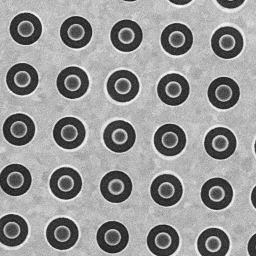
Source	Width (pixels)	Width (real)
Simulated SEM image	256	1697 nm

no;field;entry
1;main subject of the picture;an array of small figures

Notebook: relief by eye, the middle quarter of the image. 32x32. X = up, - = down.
X--XXXXXXXXXXXXXXXXXXXXXXXXXXXXX
-----XXXXXXXXX--XXXXXXXXXXXXXXXX
------XXXXXX------XXXXXXX----XXX
-XX---XXXXX--------XXXXX------XX
XXXX---XXX---XXX---XXXXX---X---X
XXXX--XXXX---XXXX--XXXX---XXX--X
-XX---XXXXX--XXX---XXXX--XXXX---
-----XXXXXX--------XXXX---XXX--X
X---XXXXXXXX------XXXXXX-------X
XXXXXXXXXXXXX---XXXXXXXXX-----XX
XXXXXXXXXXXXXXXXXXXXXXXXXXX-XXXX
XXXXXXXXXXXXXXXXXXXXXXXXXXXXXXXX
XXXXXXXXXXXXXXXXXXXXXXXXXXXXXXXX
---XXXXXXXXXXXXXXXXXXXXXXXXXXXXX
-----XXXXXX-----XXXXXXXXXXXXXXXX
XX---XXXXX-------XXXXXXX-----XXX
XXX---XXXX---XX---XXXXX-------XX
XXX---XXXX--XXXX--XXXXX--XXX--XX
XXX---XXXX--XXXX--XXXX---XXX---X
-----XXXXX---XX---XXXX---XXX---X
----XXXXXX-------XXXXXX--XXX--XX
X-XXXXXXXXX-----XXXXXXX-------XX
XXXXXXXXXXXXXXXXXXXXXXXX-----XXX
XXXXXXXXXXXXXXXXXXXXXXXXXXXXXXXX
XXXXXXXXXXXXXXXXXXXXXXXXXXXXXXXX
XXXXXXXXXXXXXXXXXXXXXXXXXXXXXXXX
---XXXXXXXXXX-XXXXXXXXXXXXXXXXXX
----XXXXXX-----XXXXXXXXX---XXXXX
XX--XXXXXX------XXXXXXX------XXX
XX---XXXX---XX---XXXXX-------XXX
XX---XXXX--XXXX--XXXXX--XXX---XX
X---XXXXX---XXX--XXXX---XXX---XX